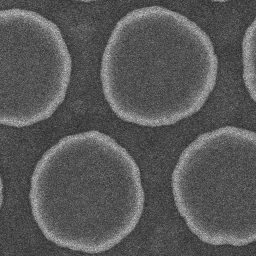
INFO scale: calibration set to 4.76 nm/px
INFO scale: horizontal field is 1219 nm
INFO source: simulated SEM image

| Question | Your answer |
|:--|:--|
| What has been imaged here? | raised bodies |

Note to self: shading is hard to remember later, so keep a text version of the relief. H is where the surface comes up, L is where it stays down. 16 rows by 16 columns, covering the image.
LLLLLLLLLLLLLLLL
HHHLLLLHHHHHLLLL
HHHHLLLHHHHHHLLH
HHHHLLLHHHHHHLLH
HHHHLLHHHHHHHLLH
HHHHLLLHHHHHHLLL
HHHHLLLHHHHHLLLL
HHLLLLLLHHHLLLLL
LLLLLHLLLLLLLHHH
LLLHHHHHLLLLHHHH
LLHHHHHHLLLHHHHH
LLHHHHHHHLLHHHHH
LLHHHHHHHLLHHHHH
LLHHHHHHHLLLHHHH
LLLHHHHHLLLLHHHH
LLLLLHLLLLLLLLLL